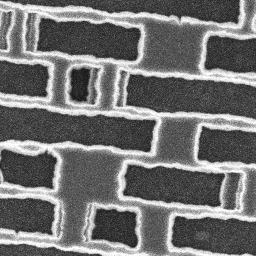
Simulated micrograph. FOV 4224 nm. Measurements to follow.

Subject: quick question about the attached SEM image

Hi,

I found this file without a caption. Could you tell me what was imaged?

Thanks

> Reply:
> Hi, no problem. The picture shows parallel lines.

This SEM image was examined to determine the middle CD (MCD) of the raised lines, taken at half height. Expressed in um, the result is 0.15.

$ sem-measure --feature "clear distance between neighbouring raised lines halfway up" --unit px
36.3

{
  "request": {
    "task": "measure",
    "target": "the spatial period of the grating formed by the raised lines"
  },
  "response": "745 nm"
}